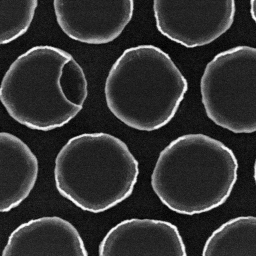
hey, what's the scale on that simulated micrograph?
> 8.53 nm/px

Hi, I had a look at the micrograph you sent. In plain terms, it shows raised bodies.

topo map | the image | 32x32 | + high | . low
++++...++++++++++..++++++++++..+
++++...++++++++++..++++++++++..+
++++...+++++++++...++++++++++...
+++.....+++++++.....++++++++....
++.......++++++......++++++.....
.......................+++......
...+++++........++++........++++
..+++++++......++++++......+++++
.+++++++......++++++++....++++++
.+++++++......+++++++++..+++++++
+++++++......++++++++++..+++++++
++++++++.....++++++++++..+++++++
+++++++++....++++++++++..+++++++
.+++++++++....++++++++....++++++
.++++++++......+++++++....++++++
...+++++........+++++......+++++
.............................++.
++.......++++++.......+++++.....
+++.....++++++++.....+++++++....
++++...++++++++++...+++++++++...
+++++..++++++++++...++++++++++..
+++++..++++++++++..+++++++++++..
++++...++++++++++..++++++++++...
++++...++++++++++..++++++++++...
+++.....++++++++....+++++++++...
++.......+++++.......+++++++....
......................+++.......
....++++........+++..........+++
..+++++++.....++++++++.....+++++
.+++++++++...++++++++++...++++++
.+++++++++...++++++++++...++++++
+++++++++++..++++++++++..+++++++